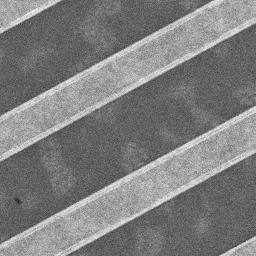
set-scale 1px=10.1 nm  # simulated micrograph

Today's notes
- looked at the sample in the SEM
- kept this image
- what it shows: one or a few lines or trenches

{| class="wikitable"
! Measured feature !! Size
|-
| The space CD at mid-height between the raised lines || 770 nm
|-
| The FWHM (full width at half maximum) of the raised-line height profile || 372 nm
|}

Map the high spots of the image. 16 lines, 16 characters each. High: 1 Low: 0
1110000000000111
1000000000011111
0000000001111100
0000000111110000
0000011111000000
0001111100000000
0011110000000000
1111100000000001
1110000000000111
1000000000011111
0000000001111100
0000000111110000
0000011111000000
0000111100000000
0011111000000000
1111100000000001